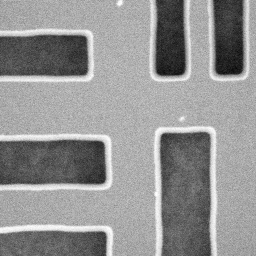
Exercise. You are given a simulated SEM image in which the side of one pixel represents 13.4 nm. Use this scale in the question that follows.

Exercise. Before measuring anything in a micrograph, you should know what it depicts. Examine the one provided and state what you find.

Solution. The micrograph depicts groups of lines, slits or small figures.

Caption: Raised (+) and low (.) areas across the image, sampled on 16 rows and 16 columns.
++++++++++..+..+
++++++++++..+..+
......++++..+..+
......++++..+..+
......++++..+..+
++++++++++++++++
++++++++++++++++
++++++++++++++++
++++++++++...+++
.......+++...+++
.......+++...+++
.......+++...+++
++++++++++...+++
++++++++++...+++
.......+++...+++
.......+++...+++